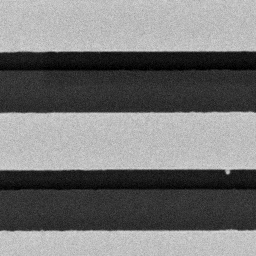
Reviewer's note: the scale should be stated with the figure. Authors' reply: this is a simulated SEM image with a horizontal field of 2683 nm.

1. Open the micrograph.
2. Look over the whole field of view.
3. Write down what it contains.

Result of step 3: lines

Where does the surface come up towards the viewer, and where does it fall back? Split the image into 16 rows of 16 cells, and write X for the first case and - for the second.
XXXXXXXXXXXXXXXX
XXXXXXXXXXXXXXXX
XXXXXXXXXXXXXXXX
----------------
----------------
----------------
----------------
XXXXXXXXXXXXXXXX
XXXXXXXXXXXXXXXX
XXXXXXXXXXXXXXXX
XXXXXXXXXXXXXXXX
----------------
----------------
----------------
XXXXXXXXXXXXXXXX
XXXXXXXXXXXXXXXX